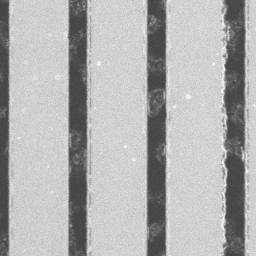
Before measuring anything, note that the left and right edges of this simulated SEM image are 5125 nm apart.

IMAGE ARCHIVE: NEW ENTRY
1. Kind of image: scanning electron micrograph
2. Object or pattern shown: one or a few lines or trenches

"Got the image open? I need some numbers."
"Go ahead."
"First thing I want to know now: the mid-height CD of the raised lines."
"433 nm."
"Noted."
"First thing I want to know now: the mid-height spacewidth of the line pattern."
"56.9 pixels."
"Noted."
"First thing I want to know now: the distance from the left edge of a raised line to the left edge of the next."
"1580 nm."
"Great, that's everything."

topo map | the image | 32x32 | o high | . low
o.......ooo.......ooo.......ooo.
o.......ooo.......ooo.......ooo.
o.......ooo.......ooo.......ooo.
o.......ooo.......ooo.......ooo.
o.......ooo.......ooo.......ooo.
o.......ooo.......ooo.......ooo.
o.......ooo.......ooo.......ooo.
o.......ooo.......ooo.......ooo.
o.......ooo.......ooo.......ooo.
o.......ooo.......ooo.......ooo.
o.......ooo.......ooo.......ooo.
o.......ooo.......ooo.......ooo.
o.......ooo.......ooo.......ooo.
o.......ooo.......o.o.......ooo.
o.......ooo.......ooo.......ooo.
o.......ooo.......ooo.......ooo.
o.......ooo.......ooo.......ooo.
o.......ooo.......ooo.......ooo.
o.......ooo.......ooo.......ooo.
o.......ooo.......ooo.......ooo.
o.......ooo.......ooo.......ooo.
o.......ooo.......ooo.......ooo.
o.......ooo.......ooo.......ooo.
o.......ooo.......ooo.......ooo.
o.......ooo.......ooo.......ooo.
o.......ooo.......ooo.......ooo.
o.......ooo.......ooo.......ooo.
o.......ooo.......ooo.......ooo.
o.......ooo.......ooo.......ooo.
o.......ooo.......ooo.......ooo.
o.......ooo.......ooo.......ooo.
o.......ooo.......ooo.......ooo.